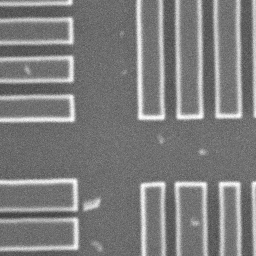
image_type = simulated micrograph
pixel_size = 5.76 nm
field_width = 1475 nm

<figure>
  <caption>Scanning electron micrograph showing groups of lines, slits or small figures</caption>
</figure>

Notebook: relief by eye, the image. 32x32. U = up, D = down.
UUUUUDDDDDDDDDDDDUUUDDUUUDDUUUDD
DDDDDDDDDDDDDDDDDUUUDDUUUDDUUUDD
DDDDDDDDUDDDDDDDDUUUDDUUUDDUUUDD
UUUUUUUUUDDDDDDDDUUUDDUUUDDUUUDD
UUUUUUUUUDDDDDDDDUUUDDUUUDDUUUDD
DDDDDDDDDDDDDDDDDUUUDDUUUDDUUUDD
DDDDDDDDDDDDDDDDDUUUDDUUUDDUUUDD
UUUUUUUUUDDDDDDDDUUUDDUUUDDUUUDD
UUUUUUUUUDDDDDDDDUUUDDUUUDDUUUDD
UUUUUUUUUDDDDDDDDUUUDDUUUDDUUUDD
DDDDDDDDDDDDDDDDDUUUDDUUUDDUUUDD
DDDDDDDDDDDDDDDDDUUUDDUUUDDUUUDD
UUUUUUUUUDDDDDDDDUUUDDUUUDDUUUDD
UUUUUUUUUDDDDDDDDDUUDDUUUDDUUUDD
UUUUUUUUUDDDDDDDDDUUDDDUUDDDDDDD
DDDDDDDDDDDDDDDDDDDDDDDDDDDDDDDD
DDDDDDDDDDDDDDDDDDDDDDDDDDDDDDDD
DDDDDDDDDDDDDDDDDDDDDDDDDDDDDDDD
DDDDDDDDDDDDDDDDDDDDDDDDDDDDDDDD
DDDDDDDDDDDDDDDDDDDDDDDDDDDDDDDD
DDDDDDDDDDDDDDDDDDDDDDDDDDDDDDDD
DDDDDDDDDDDDDDDDDDDDDDDDDDDDDDDD
DDDDDDDDDDDDDDDDDDDDDDDDDDDDDDDD
UUUUUUUUUDDDDDDDDDUUDDUUUUDDUUDD
UUUUUUUUUDDDDDDDDDUUDDUUUUDDUUDD
UUUUUUUUUDDDDDDDDDUUDDUUUUDDUUDD
DDDDDDDDDDDDDDDDDDUUDDUUUUDDUUDD
DDDUUUDUUDDDDDDDDDUUDDUUUUDDUUDD
UUUUUUUUUUDDDDDDDDUUDDUUUUDDUUDD
UUUUUUUUUUDDDDDDDDUUDDUUUUDDUUDD
UUUUUUUUUUDDDDDDDDUUDDUUUUDDUUDD
DDDDDDDDDDDDDDDDDDUUDDUUUUDDUUDD